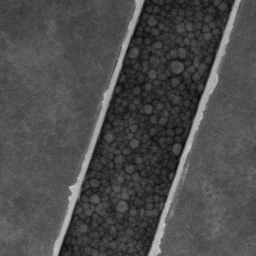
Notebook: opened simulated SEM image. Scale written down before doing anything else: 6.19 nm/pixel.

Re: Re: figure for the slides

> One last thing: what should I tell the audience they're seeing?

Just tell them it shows one or a few lines or trenches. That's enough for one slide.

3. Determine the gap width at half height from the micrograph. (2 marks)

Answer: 562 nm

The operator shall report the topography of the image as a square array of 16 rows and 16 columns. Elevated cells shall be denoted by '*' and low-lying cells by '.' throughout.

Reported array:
*********......*
********......**
********......**
********......**
*******......***
*******......***
*******......***
******......****
******......****
******......****
*****......*****
*****......*****
*****......*****
****......******
****......******
****......******